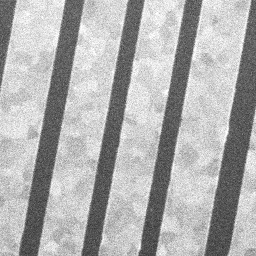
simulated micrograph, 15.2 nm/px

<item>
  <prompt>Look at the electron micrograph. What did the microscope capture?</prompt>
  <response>one or a few lines or trenches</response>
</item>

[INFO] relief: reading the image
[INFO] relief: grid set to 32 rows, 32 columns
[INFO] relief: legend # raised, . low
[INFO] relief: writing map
..######...#####..#####..######.
..######..######..#####..######.
..######..#####...#####..######.
..#####...#####...####...######.
.######...#####..#####...######.
.######...#####..#####..######..
.######..######..#####..######..
.######..######..#####..######..
.######..#####...#####..######..
######...#####...####...######..
######...#####..#####..######...
######...#####..#####..######...
######..######..#####..######...
######..#####...#####..######...
#####...#####...####...######...
#####...#####..#####...######...
#####...#####..#####..######...#
#####..######..#####..######...#
#####..#####...#####..######...#
####...#####...####...######...#
####...#####..#####...######...#
####...#####..#####..######....#
####...#####..#####..######...##
####..######..#####..######...##
####..#####...#####..######...##
###...#####...####...######...##
###...#####..#####...#####....##
###...#####..#####..######....##
###..######..#####..######...###
###..######..#####..######...###
##...#####...#####..######...###
##...#####..#####...######...###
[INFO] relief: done